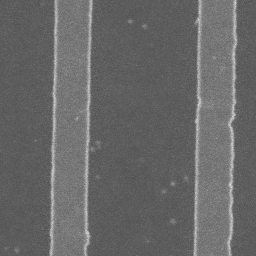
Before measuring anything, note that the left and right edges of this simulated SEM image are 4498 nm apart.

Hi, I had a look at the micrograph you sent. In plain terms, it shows one or a few lines or trenches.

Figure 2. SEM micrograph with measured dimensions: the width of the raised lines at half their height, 628 nanometres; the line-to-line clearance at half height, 1.9 micrometres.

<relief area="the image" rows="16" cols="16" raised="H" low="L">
LLLHHHLLLLLLHHHL
LLLHHHLLLLLLHHHL
LLLHHHLLLLLLHHHL
LLLHHHLLLLLLHHHL
LLLHHHLLLLLLHHHL
LLLHHHLLLLLLHHHL
LLLHHHLLLLLLHHHL
LLLHHHLLLLLLHHHL
LLLHHHLLLLLLHHHL
LLLHHLLLLLLLHHHL
LLLHHLLLLLLLHHHL
LLLHHLLLLLLLHHLL
LLLHHLLLLLLLHHHL
LLLHHLLLLLLLHHLL
LLLHHLLLLLLLHHLL
LLLHHLLLLLLLHHLL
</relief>